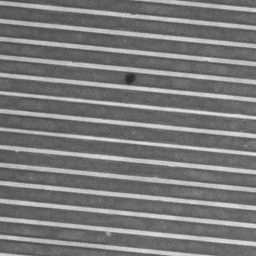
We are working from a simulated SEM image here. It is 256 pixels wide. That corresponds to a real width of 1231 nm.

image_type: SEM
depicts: parallel lines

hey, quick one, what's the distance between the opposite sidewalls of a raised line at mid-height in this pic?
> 2.99 pixels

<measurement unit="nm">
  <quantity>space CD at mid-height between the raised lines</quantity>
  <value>70.6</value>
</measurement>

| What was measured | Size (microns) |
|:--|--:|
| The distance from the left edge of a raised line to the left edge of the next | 0.086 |